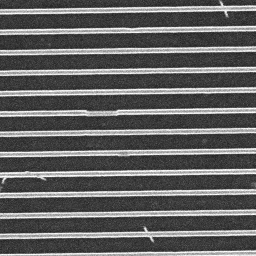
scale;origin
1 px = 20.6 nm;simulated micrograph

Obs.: parallel lines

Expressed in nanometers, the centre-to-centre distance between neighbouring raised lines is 422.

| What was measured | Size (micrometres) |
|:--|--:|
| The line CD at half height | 0.0774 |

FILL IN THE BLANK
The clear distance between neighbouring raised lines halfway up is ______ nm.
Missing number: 330